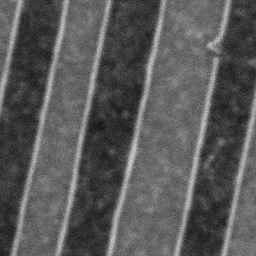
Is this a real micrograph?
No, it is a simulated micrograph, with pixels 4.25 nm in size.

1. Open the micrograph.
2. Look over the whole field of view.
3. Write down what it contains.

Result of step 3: one or a few lines or trenches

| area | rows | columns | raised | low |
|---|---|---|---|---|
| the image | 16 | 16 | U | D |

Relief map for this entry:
DUUUDDDUUUDDDDUU
DUUUDDUUUUDDDDUU
DUUUDDUUUUDDDUUU
DUUUDDUUUUDDDDUU
UUUDDDUUUDDDDUUU
UUUDDDUUUDDDDUUU
UUUDDUUUUDDDDUUU
UUUDDUUUUDDDDUUU
UUDDDUUUUDDDDUUU
UUDDDUUUDDDDUUUD
UUDDDUUUDDDDUUUD
UUDDDUUUDDDDUUUD
UUDDUUUUDDDDUUUD
UDDDUUUDDDDDUUUD
UDDDUUUDDDDUUUDD
UDDDUUUDDDDUUUDD